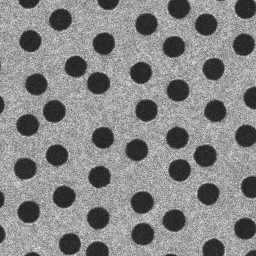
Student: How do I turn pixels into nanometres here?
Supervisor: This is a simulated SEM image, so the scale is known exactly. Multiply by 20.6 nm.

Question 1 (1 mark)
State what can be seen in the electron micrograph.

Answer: a regular array of holes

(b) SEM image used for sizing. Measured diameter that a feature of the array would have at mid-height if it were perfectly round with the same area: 462 nanometres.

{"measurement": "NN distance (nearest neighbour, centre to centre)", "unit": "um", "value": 0.745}